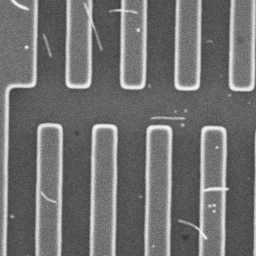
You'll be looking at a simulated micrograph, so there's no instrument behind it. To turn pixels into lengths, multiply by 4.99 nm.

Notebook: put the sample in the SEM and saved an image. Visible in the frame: groups of lines, slits or small figures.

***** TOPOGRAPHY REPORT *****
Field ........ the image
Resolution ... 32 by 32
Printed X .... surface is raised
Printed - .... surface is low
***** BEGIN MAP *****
XXXXX----XX----XXX----XXX----XXX
XXXX-----XX----XXX----XXX----XXX
XXXX-----XX----XXX----XXX----XXX
XXXX----XXX----XXX----XXX----XXX
XXXX----XXX----XXX----XXX----XXX
XXXX----XXX----XXX----XXX----XXX
XXXX----XXX----XXX----XXX----XXX
XXXX----XXX----XXX----XXX----XXX
XXXX----XXX----XXX----XXX----XXX
XXXX----XXX----XXX----XXX----XXX
XXXX-----XX----XXX----XXX----XXX
X-------------------------------
X-------------------------------
X-------------------------------
X-------------------------------
X-------------------------------
X----XXX----XX----XXX----XXX----
X----XXX----XX----XXX----XXX----
X----XXX----XX----XXX----XXX----
X----XXX----XX----XXX----XXX----
X----XXX----XX----XXX----XXX----
X----XXX----XX----XXX----XXX----
X----XXX----XX----XXX----XXX----
X----XXX----XX----XXX----XXX----
X----XX-----XX----XXX----XXX----
X----XX----XXX----XXX----XXX----
X----XX----XXX----XXX----XXX----
X----XX----XXX----XXX----XXX----
X----XX----XXX----XXX----XXX----
X----XX----XXX----XXX----XXX----
X----XX----XXX----XXX----XXX----
X----XX----XXX----XXX----XXX----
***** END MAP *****